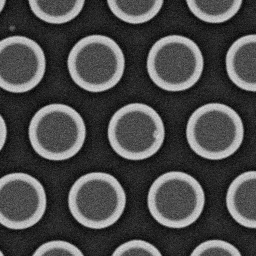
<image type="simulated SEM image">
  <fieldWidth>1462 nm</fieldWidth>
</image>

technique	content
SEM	an array of small figures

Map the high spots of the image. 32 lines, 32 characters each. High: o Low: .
o...oooooo....oooooo...ooooooo..
....oooooo....oooooo....oooooo..
.....oooo......oooo......ooo....
................................
...........oo........o.........o
ooooo.....ooooo....ooooo.....ooo
ooooo....oooooo....oooooo....ooo
oooooo...oooooo...ooooooo...oooo
oooooo...oooooo...ooooooo...oooo
ooooo....oooooo....oooooo....ooo
ooooo.....oooo......oooo.....ooo
..o.............................
................................
.....oooo......oooo......oooo...
....oooooo....oooooo....oooooo..
o...ooooooo...oooooo...ooooooo..
o...ooooooo...oooooo...ooooooo..
o...ooooooo...oooooo...ooooooo..
....oooooo....oooooo....oooooo..
.....oooo......oooo......oooo...
................................
...............................o
ooooo.....ooooo.....oooo.....ooo
ooooo....oooooo....oooooo....ooo
oooooo...ooooooo...oooooo...oooo
oooooo...ooooooo...oooooo...oooo
ooooo....oooooo....oooooo....ooo
ooooo.....ooooo.....oooo.....ooo
.oo........oo...................
................................
......ooo......oooo......oooo...
....oooooo....oooooo....oooooo..